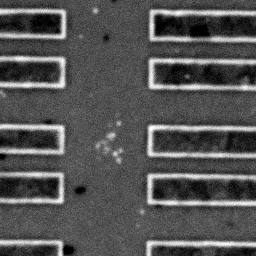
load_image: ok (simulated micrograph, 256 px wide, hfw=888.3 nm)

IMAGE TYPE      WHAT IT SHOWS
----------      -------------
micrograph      wiring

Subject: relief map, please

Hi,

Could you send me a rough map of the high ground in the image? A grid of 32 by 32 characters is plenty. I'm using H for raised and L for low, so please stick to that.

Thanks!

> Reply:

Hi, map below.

LLLLLLLLLLLLLLLLLLLLLLLLLLLLLLLL
HHHHHHHHLLLLLLLLLLLHHLLLLLLLLLLL
HHHHHHHHLLLLLLLLLLLHHHHHHHHHHHHH
HHHHHHHHLLLLLLLLLLLHHHHHHHHHHHHH
LLLLHHHHLLLLLLLLLLLHHHHHHHHHHHHH
LLLLLLLLLLLLLLLLLLLLLLLLLLLLLLLL
LLLLLLLLLLLLLLLLLLLLLLLLLLLLLLLL
HHHHHHHLLLLLLLLLLLLLLLLLLLLLLLLL
HHHHHHHHLLLLLLLLLLLHHHHHHHHHHHHH
HHHHHHHHLLLLLLLLLLLHHHHHHHHHHHHH
HHHHHHHHLLLLLLLLLLLHHHHHHHHHHHHH
LLLLLLLLLLLLLLLLLLLLLLLLLLLLLLLL
LLLLLLLLLLLLLLLLLLLLLLLLLLLLLLLL
LLLLLLLLLLLLLLLLLLLLLLLLLLLLLLLL
LLLLLLLLLLLLLLLLLLLLLLLLLLLLLLLL
LLLLLLLLLLLLLLLLLLLLLLLLLLLLLLLL
HHHHHHHHLLLLLLLLLLLHHHHHHHHHHHHH
HHHHHHHHLLLLLLLLLLLHHHHHHHHHHHHH
HHHHHHHHLLLLLLLLLLLHHHHHHHHHHHHH
LLLLLLLLLLLLLLLLLLLLLLLLLLLLLLLL
LLLLLLLLLLLLLLLLLLLLLLLLLLLLLLLL
LLLLLLLLLLLLLLLLLLLLLLLLLLLLLLLL
HHHHHHHHLLLLLLLLLLLHHHHHHHHHHHHH
HHHHHHHHLLLLLLLLLLLHHHHHHHHHHHHH
HHHHHHHHLLLLLLLLLLLHHHHHHHHHHHHH
LLLLLLLLLLLLLLLLLLLLLLLLLLLLLLLL
LLLLLLLLLLLLLLLLLLLLLLLLLLLLLLLL
LLLLLLLLLLLLLLLLLLLLLLLLLLLLLLLL
LLLLLLLLLLLLLLLLLLLLLLLLLLLLLLLL
LLLLLLLLLLLLLLLLLLLLLLLLLLLLLLLL
HHHHHHHLLLLLLLLLLLLHHHHHHHHLLLLL
HHHHHHHHLLLLLLLLLLLHHHHHHHHHHHHH